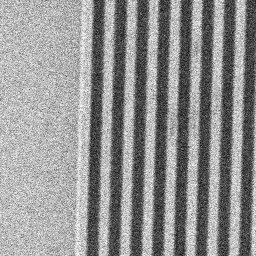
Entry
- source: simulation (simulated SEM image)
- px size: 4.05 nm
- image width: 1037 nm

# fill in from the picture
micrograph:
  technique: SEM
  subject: parallel lines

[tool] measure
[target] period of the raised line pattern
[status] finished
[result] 0.0883 um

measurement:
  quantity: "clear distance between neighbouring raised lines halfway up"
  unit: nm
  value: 43.1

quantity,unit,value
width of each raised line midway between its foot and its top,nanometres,43.1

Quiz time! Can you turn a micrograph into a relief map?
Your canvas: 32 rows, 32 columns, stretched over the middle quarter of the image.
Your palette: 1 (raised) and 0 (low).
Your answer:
00001110001100011100011000111000
00001110001100011100011000111000
00001110001100011100011000111000
00001110001100011100011000111000
00001110001100011100011000111000
00001110001100011100011000111001
00001110001100011100011000111001
00001110001100011100011000111001
00001110001100011100011000111001
00001110001100011100011000110001
00001110001100011100111000110001
00001110001100011100111000110001
00001110001100011100111000110001
00001110001100011100111000110001
00001110011100011000111000110001
00001110011100011000111000110001
00001110011100011000111000110001
00001110011100011000111000110001
00001100011100011000111000110001
00001100011100011000111000110001
00001100011100011000111000110001
00001100011100011000111000110001
00001100011100011000111000110001
00001100011100011000111000110001
00001100011100011000111000110001
00001100011100011000111000110001
00001100011100011000110000110001
00001100011100011000111000110001
00001100011100011000110000110001
00001100011100011000110001110001
00011100011000111000110001110001
00011100011000011000110001110001